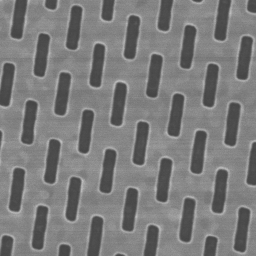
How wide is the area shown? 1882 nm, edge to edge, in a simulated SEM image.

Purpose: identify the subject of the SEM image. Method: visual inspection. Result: a regular array of holes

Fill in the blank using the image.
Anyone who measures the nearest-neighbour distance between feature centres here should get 0.32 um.